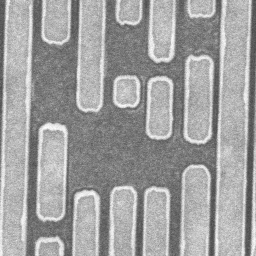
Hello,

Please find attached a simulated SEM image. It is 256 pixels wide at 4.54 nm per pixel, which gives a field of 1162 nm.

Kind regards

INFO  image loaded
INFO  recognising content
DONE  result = parallel lines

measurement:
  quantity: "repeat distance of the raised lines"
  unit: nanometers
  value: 164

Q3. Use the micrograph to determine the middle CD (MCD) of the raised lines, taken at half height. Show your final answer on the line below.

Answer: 126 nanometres